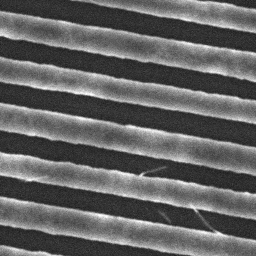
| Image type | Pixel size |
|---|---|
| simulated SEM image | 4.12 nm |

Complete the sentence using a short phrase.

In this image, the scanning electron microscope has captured lines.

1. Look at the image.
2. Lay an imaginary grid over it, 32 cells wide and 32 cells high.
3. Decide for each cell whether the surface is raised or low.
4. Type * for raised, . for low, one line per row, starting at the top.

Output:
............*****************...
*.................**************
******.................*********
************................****
******************..............
......******************........
...........********************.
**...............***************
*******................*********
*************...............****
..*****************.............
.........****************.......
..............******************
***.................************
*********.................******
**************..................
..*******************...........
.......********************.....
.............*******************
***...............**************
*********...............********
***************..............***
...*******************..........
..........*****************.....
...............*****************
*****................***********
***********................*****
*****************...............
...********************.........
.........********************...
...............*****************
****.................***********